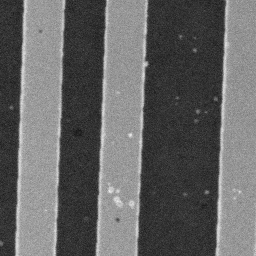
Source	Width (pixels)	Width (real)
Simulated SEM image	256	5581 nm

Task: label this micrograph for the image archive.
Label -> lines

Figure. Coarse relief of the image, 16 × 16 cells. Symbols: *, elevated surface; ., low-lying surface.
..**...**.....**
.***...**.....**
.***...**.....**
.***...**.....**
.***...**.....**
.***..***.....**
.***..***.....**
.***..***.....**
.***..***.....**
.***..***.....**
.***..***.....**
.***..***.....**
.***..***.....**
.***..***.....**
.***..***.....**
.***..***.....**